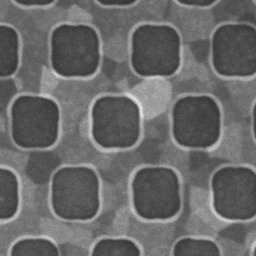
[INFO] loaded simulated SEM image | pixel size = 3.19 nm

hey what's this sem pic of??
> holes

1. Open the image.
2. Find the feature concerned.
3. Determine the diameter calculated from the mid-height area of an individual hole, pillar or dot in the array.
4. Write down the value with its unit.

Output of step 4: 0.178 micrometres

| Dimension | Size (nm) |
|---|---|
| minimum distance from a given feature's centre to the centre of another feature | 256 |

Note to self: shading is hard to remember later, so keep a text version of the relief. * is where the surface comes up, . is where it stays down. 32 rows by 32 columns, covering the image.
**....*******....******....*****
********************************
********************************
..*****.....*****.....*****.....
..****......****......*****.....
...***.......***.......***......
..****.......***.......***......
..****.......***.......***......
..****......****......*****.....
.*******...*******...*******....
********************************
********************************
**.....*****.....*****.....*****
*......****......****.......****
*......****.......***.......****
*......****.......***.......****
*......****.......***.......****
**.....*****.....*****.....*****
***...*******...*******...******
********************************
********************************
..*****.....*****.....*****.....
..****......****.......***......
..****......****.......***......
..****.......***.......***......
..****.......***.......****.....
..*****.....*****.....*****.....
.*******...*******...********..*
********************************
********************************
**.....*****.....*****.....*****
*......****.......***......*****